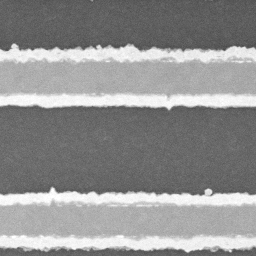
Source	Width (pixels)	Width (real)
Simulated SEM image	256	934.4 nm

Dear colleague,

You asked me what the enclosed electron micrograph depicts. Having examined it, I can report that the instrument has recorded one or a few lines or trenches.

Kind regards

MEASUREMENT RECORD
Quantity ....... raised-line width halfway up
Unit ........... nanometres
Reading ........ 170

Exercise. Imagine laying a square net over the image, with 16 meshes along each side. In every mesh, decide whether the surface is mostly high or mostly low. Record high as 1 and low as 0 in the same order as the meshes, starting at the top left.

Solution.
0000000000000000
0000000000000000
0000000000000000
1111111111111111
1111111111111111
1111111111111111
0000000000000000
0000000000000000
0000000000000000
0000000000000000
0000000000000000
0000000000000000
1111111111110111
1111111111111111
1111111111111111
0000000000000000